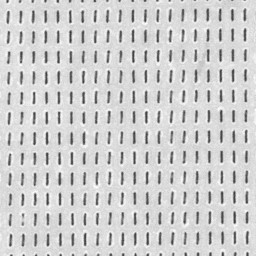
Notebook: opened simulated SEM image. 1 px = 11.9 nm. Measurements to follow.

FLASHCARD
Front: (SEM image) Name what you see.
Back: a regular array of holes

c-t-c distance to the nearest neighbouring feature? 0.145 micrometres